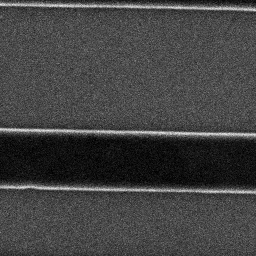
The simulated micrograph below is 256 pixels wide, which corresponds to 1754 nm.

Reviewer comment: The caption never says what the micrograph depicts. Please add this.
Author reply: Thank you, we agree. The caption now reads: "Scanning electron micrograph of one or a few lines or trenches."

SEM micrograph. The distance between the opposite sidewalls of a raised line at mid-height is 401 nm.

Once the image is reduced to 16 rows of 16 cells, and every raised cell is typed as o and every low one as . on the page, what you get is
...........ooooo
................
................
................
................
................
................
................
oooooooooooooooo
oooooooooooooooo
oooooooooooooooo
oooooooooooooooo
................
................
................
................